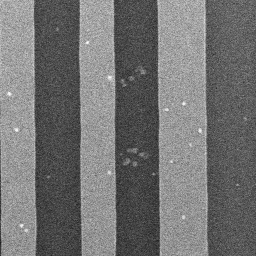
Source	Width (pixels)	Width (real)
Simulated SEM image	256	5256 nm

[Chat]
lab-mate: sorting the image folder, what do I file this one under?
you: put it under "groups of lines, slits or small figures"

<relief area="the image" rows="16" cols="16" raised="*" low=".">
**...**...***...
**...**...***...
**...**...***...
**...**...***...
**...**...***...
**...**...***...
**...**...***...
**...**...***...
**...**...***...
**...**...***...
**...**...***...
**...**...***...
**...**...***...
**...**...***...
**...**...***...
**...**...***...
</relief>